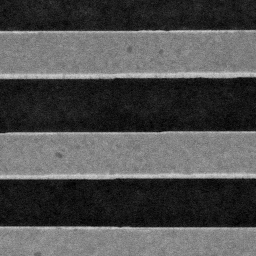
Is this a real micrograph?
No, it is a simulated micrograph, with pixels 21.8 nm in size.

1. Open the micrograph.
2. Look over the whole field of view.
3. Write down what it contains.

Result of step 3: lines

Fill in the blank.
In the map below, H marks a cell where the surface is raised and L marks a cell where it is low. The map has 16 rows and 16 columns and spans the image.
LLLLLLLLLLLLLLLL
LLLLLLLLLLLLLLLL
HHHHHHHHHHHHHHHH
HHHHHHHHHHHHHHHH
HHHHHHHHHHHHHHHH
LLLLLLLLLLLLLLLL
LLLLLLLLLLLLLLLL
LLLLLLLLLLLLLLLL
HHHHHHHHHHHHHHHH
HHHHHHHHHHHHHHHH
HHHHHHHHHHHHHHHH
LLLLLLLLLLLLLLLL
LLLLLLLLLLLLLLLL
LLLLLLLLLLLLLLLL
HHHHHHHHHHHHHHHH
HHHHHHHHHHHHHHHH